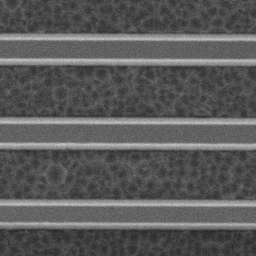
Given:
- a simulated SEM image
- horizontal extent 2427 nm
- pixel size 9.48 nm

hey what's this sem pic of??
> one or a few lines or trenches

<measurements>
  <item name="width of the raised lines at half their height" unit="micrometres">0.24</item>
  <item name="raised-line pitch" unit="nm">781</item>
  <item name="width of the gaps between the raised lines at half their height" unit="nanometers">547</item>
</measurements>